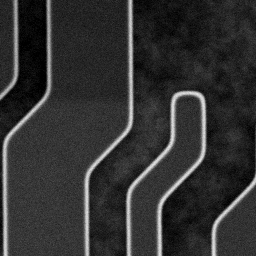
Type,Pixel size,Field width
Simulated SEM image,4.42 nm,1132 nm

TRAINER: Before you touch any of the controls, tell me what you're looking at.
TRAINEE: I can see groups of lines, slits or small figures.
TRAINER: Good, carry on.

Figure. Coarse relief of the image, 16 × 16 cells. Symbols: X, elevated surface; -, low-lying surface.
X--XXXXX--------
X--XXXXX--------
X--XXXXX--------
X--XXXXX--------
X--XXXXX--------
X--XXXXX--------
--XXXXXX---XX---
-XXXXXXX---XX---
-XXXXXXX---XX---
XXXXXXX---XXX---
XXXXXX---XXX----
XXXXX---XXX-----
XXXXX---XX-----X
XXXXX---XX----XX
XXXXX---XX---XXX
XXXXX---XX---XXX